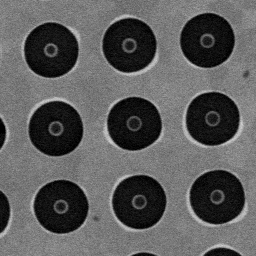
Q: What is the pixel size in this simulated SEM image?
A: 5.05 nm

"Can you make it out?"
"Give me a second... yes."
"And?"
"an array of small figures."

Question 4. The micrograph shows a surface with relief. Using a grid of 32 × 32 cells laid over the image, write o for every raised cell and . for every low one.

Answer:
oooooooooooooooooooooooooooooooo
oooooooooooooooooooooooooooooooo
ooooooooooooooo..ooooooo....oooo
oooo....ooooo......oooo......ooo
ooo.......ooo......oooo......ooo
ooo.......ooo.......oo...oo..ooo
ooo...o...ooo.......ooo......ooo
ooo.......ooo......oooo.....oooo
oooo.....ooooo....oooooooooooooo
ooooo...oooooooooooooooooooooooo
oooooooooooooooooooooooooooooooo
oooooooooooooooooooooooooo.ooooo
ooooooo.ooooooo...oooooo.....ooo
oooo.....ooooo......ooo.......oo
oooo......ooo.......ooo...o...oo
.ooo......ooo...oo..ooo...o...oo
.oo...o...ooo.......ooo.......oo
.ooo......oooo......oooo.....ooo
ooooo.....ooooo...oooooooooooooo
oooooo..oooooooooooooooooooooooo
oooooooooooooooooooooooooooooooo
oooooooooooooooooooooooooo...ooo
ooooooo.ooooooo....oooooo.....oo
ooooo.....oooo......oooo......oo
.ooo.......ooo...o...ooo..oo...o
.ooo...o...ooo...o...ooo.......o
.ooo.......ooo.......ooo......oo
.oooo......oooo.....ooooo....ooo
.ooooo....oooooo...ooooooooooooo
oooooooooooooooooooooooooooooooo
oooooooooooooooooooooooooooooooo
oooooooooooooooooooooooooo....oo